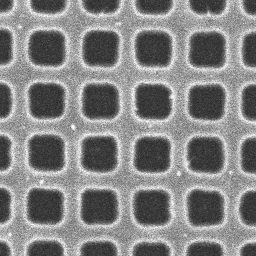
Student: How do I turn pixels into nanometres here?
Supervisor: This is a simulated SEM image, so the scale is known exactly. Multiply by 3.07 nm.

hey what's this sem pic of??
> a regular array of holes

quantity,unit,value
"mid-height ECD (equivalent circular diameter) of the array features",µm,0.116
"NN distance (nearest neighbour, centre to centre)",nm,161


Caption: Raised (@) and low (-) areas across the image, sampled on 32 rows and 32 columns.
--@@----@@@----@@----@@@----@@--
@@@@@--@@@@---@@@@---@@@----@@@-
@@@@@@@@@@@@@@@@@@@@@@@@@@@@@@@@
@@@@@@@@@@@@@@@@@@@@@@@@@@@@@@@@
-@@@----@@@----@@----@@@----@@@-
--@@----@@-----@@----@@@----@@--
--@@----@@-----@@----@@@----@@--
-@@@----@@@----@@----@@@----@@--
@@@@@@@@@@@@@@@@@@@@@@@@@@@@@@@@
@@@@@@@@@@@@@@@@@@@@@@@@@@@@@@@@
@@@@---@@@@@@@@@@@--@@@@@@@@@@@@
-@@@----@@-----@@----@@@----@@--
-@@@----@@-----@@----@@@----@@--
-@@@----@@-----@@----@@@----@@--
-@@@---@@@@---@@@----@@@----@@@-
@@@@@@@@@@@@@@@@@@@@@@@@@@@@@@@@
@@@@@@@@@@@@@@@@@@@@@@@@@@@@@@@@
-@@@----@@@---@@@----@@@---@@@@-
-@@@----@@-----@@----@@@----@@--
-@@@----@@-----@@----@@-----@@--
-@@@----@@-----@@----@@@----@@--
@@@@@@@@@@@@@@@@@@--@@@@@@-@@@@-
@@@@@@@@@@@@@@@@@@@@@@@@@@@@@@@@
@@@@@@@@@@@@@@@@@@@@@@@@@@@@@@@@
-@@@----@@----@@@----@@@----@@--
-@@-----@@-----@@----@@-----@@--
-@@-----@@-----@@----@@@----@@--
-@@@---@@@----@@@----@@@----@@--
@@@@@@@@@@@@@@@@@@@@@@@@@@@@@@@@
@@@@@@@@@@@@@@@@@@@@@@@@@@@@@@@@
-@@@---@@@@---@@@---@@@@---@@@@-
-@@-----@@-----@@----@@-----@@--